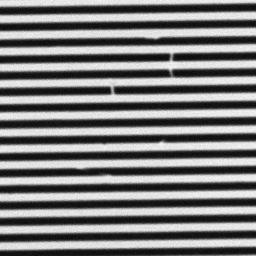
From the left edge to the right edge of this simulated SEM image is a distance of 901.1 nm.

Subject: parallel lines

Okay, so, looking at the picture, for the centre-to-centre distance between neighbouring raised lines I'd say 57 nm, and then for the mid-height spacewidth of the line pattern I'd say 7.61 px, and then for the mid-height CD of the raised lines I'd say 0.0294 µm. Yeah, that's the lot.